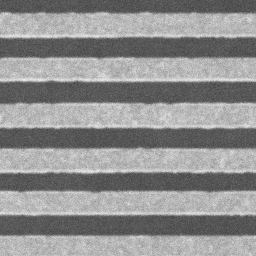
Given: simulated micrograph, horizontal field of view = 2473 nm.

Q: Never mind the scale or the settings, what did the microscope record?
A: lines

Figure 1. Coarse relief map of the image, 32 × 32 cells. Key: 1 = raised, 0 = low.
00000000000000000000000000000000
00000000000000000000000000000000
11111111111111111111111111111111
11111111111111111111111111111111
11111111111111111111111111111111
00000000000000000000000000000000
00000000000000000000000000000000
11111111111111111111111111111111
11111111111111111111111111111111
11111111111111111111111111111111
00000000000000000000000000000000
00000000000000000000000000000000
00000000000000000000000000000000
11111111111111111111111111111111
11111111111111111111111111111111
11111111111111111111111111111111
00000000000000000000000000000000
00000000000000000000000000000000
00000000000000000000000000000000
11111111111111111111111111111111
11111111111111111111111111111111
10010000000101000000000010000000
00000000000000000000000000000000
00000000000000000000000000000000
11111111111111111111111111111111
11111111111111111111111111111111
11111111111111111111111111111111
00000000000000000000000000000000
00000000000000000000000000000000
00000000000000000000000000000000
11111111111111111111111111111111
11111111111111111111111111111111